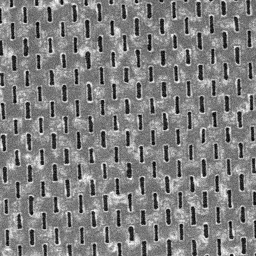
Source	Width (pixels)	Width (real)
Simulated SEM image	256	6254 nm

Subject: a regular array of holes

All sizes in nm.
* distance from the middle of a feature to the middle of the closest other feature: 478